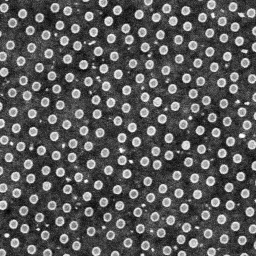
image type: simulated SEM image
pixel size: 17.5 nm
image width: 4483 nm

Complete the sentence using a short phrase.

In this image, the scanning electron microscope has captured a regular array of raised bodies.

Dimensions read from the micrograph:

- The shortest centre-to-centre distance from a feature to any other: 271 nm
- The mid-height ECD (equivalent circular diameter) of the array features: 135 nanometres